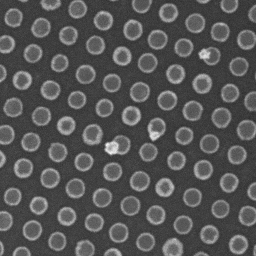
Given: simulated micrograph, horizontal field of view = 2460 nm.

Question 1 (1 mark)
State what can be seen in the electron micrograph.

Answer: a regular array of raised bodies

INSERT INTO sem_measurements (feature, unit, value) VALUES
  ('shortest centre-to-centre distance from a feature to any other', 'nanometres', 258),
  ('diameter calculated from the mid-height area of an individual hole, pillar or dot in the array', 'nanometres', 173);